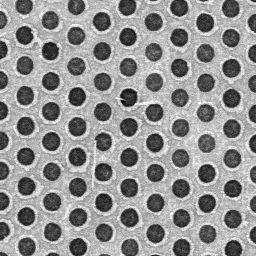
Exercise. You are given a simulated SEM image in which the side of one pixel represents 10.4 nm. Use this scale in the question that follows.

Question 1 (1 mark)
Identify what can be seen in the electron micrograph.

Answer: a regular array of holes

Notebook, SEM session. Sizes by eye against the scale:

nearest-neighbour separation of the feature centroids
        0.307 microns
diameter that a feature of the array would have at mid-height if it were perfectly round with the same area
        193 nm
